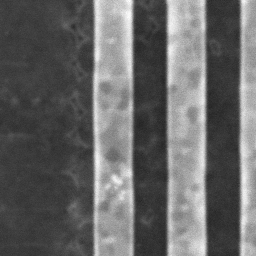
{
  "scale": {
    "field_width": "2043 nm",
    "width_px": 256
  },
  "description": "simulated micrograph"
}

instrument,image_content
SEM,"wiring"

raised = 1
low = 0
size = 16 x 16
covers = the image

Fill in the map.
0000001100011001
0000001100011001
0000001100011001
0000001100011001
0000001100011001
0000001100011001
0000001100011001
0000001100011001
0000001100011001
0000001100011001
0000001100011001
0000001100011001
0000001100011001
0000001100011001
0000001100011001
0000001100011001